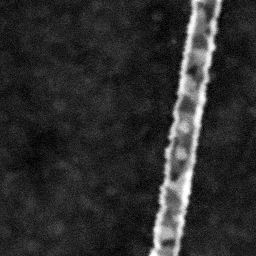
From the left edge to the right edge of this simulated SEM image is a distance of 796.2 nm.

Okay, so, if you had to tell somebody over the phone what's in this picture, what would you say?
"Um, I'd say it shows one or a few lines or trenches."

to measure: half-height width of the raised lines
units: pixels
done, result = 23.8